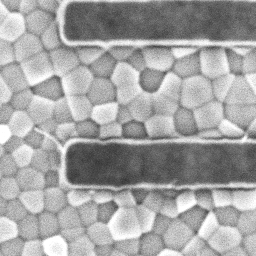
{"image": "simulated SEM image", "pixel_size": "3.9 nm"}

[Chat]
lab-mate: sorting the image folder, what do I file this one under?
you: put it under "one or a few lines or trenches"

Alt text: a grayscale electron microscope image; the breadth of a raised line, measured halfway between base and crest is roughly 182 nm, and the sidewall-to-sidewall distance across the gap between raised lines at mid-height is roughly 378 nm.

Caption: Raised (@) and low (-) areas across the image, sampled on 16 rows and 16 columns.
----@@@@@@@@@@@@
----@@@@@@@@@@@@
----@@@@@@@@@@@@
----------------
----------------
----------------
----------------
----------------
----------------
----@@@@@@@@@@@@
----@@@@@@@@@@@@
----@@@@@@@@@@@@
----------------
----------------
----------------
----------------